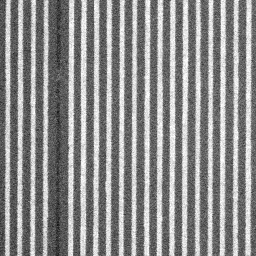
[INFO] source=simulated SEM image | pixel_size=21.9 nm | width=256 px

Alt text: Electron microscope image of parallel lines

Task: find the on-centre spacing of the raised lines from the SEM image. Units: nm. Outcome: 278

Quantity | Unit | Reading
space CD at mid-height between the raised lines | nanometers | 192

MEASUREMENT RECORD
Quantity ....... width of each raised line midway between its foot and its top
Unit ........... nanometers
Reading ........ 84.9